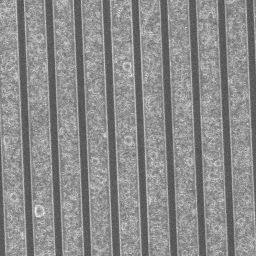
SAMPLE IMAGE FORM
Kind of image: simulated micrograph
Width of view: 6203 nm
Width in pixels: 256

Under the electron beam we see parallel lines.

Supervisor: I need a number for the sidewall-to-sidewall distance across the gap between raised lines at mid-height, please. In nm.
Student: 185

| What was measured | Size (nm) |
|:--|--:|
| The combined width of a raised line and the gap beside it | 694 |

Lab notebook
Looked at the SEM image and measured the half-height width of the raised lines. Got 21 px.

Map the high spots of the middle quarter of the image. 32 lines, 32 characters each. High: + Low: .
+++..+++++..+++++...+++++..+++++
+++..+++++..+++++...+++++..+++++
+++..+++++..+++++...+++++..+++++
+++..+++++..+++++...+++++..+++++
+++..+++++..++++++..+++++..+++++
+++..+++++...+++++..+++++..+++++
+++..+++++...+++++..+++++..+++++
+++..+++++...+++++..+++++..+++++
+++..++++++..+++++..+++++..+++++
+++...+++++..+++++..+++++..+++++
+++...+++++..+++++..+++++..+++++
+++...+++++..+++++..+++++..+++++
++++..+++++..+++++..+++++..+++++
++++..+++++..+++++..+++++..+++++
++++..+++++..+++++..+++++..+++++
++++..+++++..+++++..+++++..+++++
++++..+++++..+++++..+++++..+++++
++++..+++++..+++++..+++++..+++++
++++..+++++..+++++..+++++..+++++
++++..+++++..+++++..+++++..+++++
++++..+++++..+++++..+++++..+++++
++++..+++++..+++++..+++++...++++
++++..+++++..+++++..+++++...++++
++++..+++++..+++++..+++++...++++
++++..+++++..+++++..++++++..++++
++++..+++++..+++++...+++++..++++
++++..+++++..+++++...+++++..++++
++++..+++++..+++++...+++++..++++
++++..+++++..++++++..+++++..++++
++++..+++++...+++++..+++++..++++
++++..+++++...+++++..+++++..++++
++++..+++++...+++++..+++++..++++